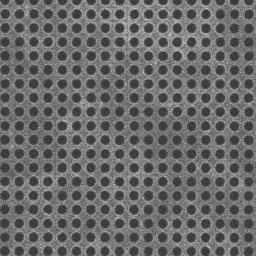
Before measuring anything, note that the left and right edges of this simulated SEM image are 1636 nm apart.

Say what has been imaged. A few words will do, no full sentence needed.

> a regular array of holes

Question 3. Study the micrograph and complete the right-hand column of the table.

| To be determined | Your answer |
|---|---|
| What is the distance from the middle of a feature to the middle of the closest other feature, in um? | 0.0888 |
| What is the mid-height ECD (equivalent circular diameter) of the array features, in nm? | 59.9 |